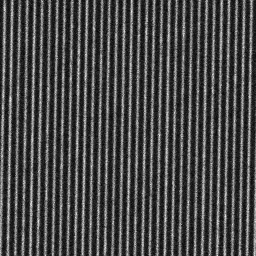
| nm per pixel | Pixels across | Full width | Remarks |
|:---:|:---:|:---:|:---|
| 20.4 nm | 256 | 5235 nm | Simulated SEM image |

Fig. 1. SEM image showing parallel lines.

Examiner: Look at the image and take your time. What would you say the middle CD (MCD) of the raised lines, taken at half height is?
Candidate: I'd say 28.1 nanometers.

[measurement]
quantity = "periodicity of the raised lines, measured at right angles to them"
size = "0.153 µm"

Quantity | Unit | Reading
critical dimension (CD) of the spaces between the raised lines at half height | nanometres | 128